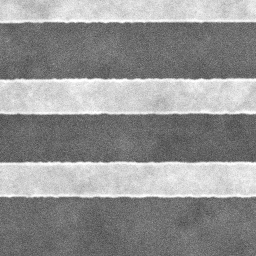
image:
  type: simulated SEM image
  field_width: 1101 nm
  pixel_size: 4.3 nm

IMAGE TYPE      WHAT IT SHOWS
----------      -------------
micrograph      lines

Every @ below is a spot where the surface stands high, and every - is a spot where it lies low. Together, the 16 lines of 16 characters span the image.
@@@@@@@@@@@@@@@@
----------------
----------------
----------------
----------------
@@@@@@@@@@@@@@@@
@@@@@@@@@@@@@@@@
----------------
----------------
----------------
@@@@@@@@@@@@@@@@
@@@@@@@@@@@@@@@@
----------------
----------------
----------------
----------------